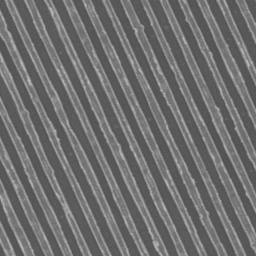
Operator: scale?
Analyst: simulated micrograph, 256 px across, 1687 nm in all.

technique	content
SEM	parallel lines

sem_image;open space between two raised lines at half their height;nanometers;65.2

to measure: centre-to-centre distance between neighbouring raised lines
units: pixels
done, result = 17.5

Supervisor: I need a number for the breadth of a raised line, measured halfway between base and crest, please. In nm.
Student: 47.2